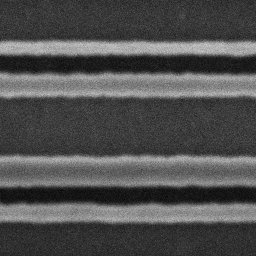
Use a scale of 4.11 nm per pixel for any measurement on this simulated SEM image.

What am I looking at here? lines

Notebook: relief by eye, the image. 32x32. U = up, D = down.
DDDDDDDDDDDDDDDDDDDDDDDDDDDDDDDD
DDDDDDDDDDDDDDDDDDDDDDDDDDDDDDDD
DDDDDDDDDDDDDDDDDDDDDDDDDDDDDDDD
DDDDDDDDDDDDDDDDDDDDDDDDDDDDDDDD
DDDDDDDDDDDDDDDDDDDDDDDDDDDDDDDD
UUUUUUUUUUUUUUUUUUUUUUUUUUUUUUUU
UUUUUUUUUUUUUUUUUUUUUUUUUUUUUUUU
DDDDDDDDDDDDDDDDDDDDDDDDDDDDDDDD
DDDDDDDDDDDDDDDDDDDDDDDDDDDDDDDD
UUUUDUUDDUUDUUUUUUUUUUUUUUUDUDDD
UUUUUUUUUUUUUUUUUUUUUUUUUUUUUUUU
UUUUUUUUUUUUUUUUUUUUUUUUUUUUUUUU
DDDDDDDDDDDDDDDDDDDDDDDDDDDDDDDD
DDDDDDDDDDDDDDDDDDDDDDDDDDDDDDDD
DDDDDDDDDDDDDDDDDDDDDDDDDDDDDDDD
DDDDDDDDDDDDDDDDDDDDDDDDDDDDDDDD
DDDDDDDDDDDDDDDDDDDDDDDDDDDDDDDD
DDDDDDDDDDDDDDDDDDDDDDDDDDDDDDDD
DDDDDDDDDDDDDDDDDDDDDDDDDDDDDDDD
DDDDDDDDDDDDDDDDDDDDDDDDDDDDDDDD
UUUUUUUUUUUUUUUUUUUUUUUUUUUUUUUU
UUUUUUUUUUUUUUUUUUUUUUUUUUUUUUUU
UUUUUUUUUUUUUUUUUUUUUUUUUUUUUUUU
DDDDDDDDDDDDDDDDDDDDDDDDDDDDDDDD
DDDDDDDDDDDDDDDDDDDDDDDDDDDDDDDD
DDDDDDDDDDDDDDDDDDDDDDDDDDDDDDDD
UUUUUUUUUUUUUUUUUUUUUUUUUUUUUUUU
UUUUUUUUUUUUUUUUUUUUUUUUUUUUUUUU
DDDDDDDDDDDDDDDDDDDDDDDDDDDDDDDD
DDDDDDDDDDDDDDDDDDDDDDDDDDDDDDDD
DDDDDDDDDDDDDDDDDDDDDDDDDDDDDDDD
DDDDDDDDDDDDDDDDDDDDDDDDDDDDDDDD